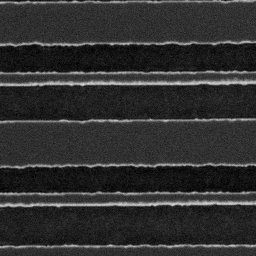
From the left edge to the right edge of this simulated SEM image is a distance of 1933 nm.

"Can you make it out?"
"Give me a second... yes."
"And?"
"lines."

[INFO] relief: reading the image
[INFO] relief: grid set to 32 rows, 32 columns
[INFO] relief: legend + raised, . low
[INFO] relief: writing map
++++++++++++++++++++++++++++++++
++++++++++++++++++++++++++++++++
++++++++++++++++++++++++++++++++
++++++++++++++++++++++++++++++++
++++++++++++++++++++++++++++++++
++++++++++++.++++++++.++..+.....
................................
................................
................................
++++++++++++++++++++++++++++++++
+++++++++++++++++++++++++.......
................................
................................
................................
................................
++++++++++++++++++++++++++++++++
++++++++++++++++++++++++++++++++
++++++++++++++++++++++++++++++++
++++++++++++++++++++++++++++++++
++++++++++++++++++++++++++++++++
++++++++++++++++++++++++++++++++
................................
................................
................................
++++++++++++++++++++++++++++++++
++++++++++++++++++++++++++++++++
................................
................................
................................
................................
................................
++++++++++++++++++++++++++++++++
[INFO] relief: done